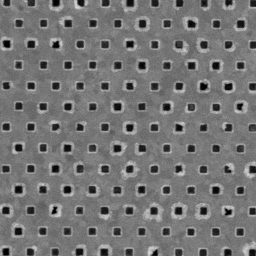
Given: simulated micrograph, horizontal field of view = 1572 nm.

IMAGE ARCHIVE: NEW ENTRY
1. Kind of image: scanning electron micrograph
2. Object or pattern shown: a regular array of holes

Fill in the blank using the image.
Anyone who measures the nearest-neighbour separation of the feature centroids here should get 23.8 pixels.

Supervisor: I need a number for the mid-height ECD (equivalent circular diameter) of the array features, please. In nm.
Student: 56.7